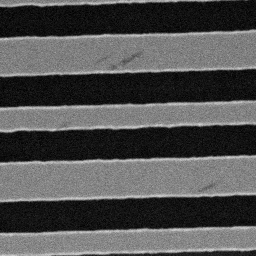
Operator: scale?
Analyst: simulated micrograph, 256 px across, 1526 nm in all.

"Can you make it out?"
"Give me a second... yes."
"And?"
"lines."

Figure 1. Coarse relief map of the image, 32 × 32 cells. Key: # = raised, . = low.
#############...................
................................
................................
................................
..........######################
################################
################################
################################
################################
................................
................................
................................
................................
################################
################################
################################
##..............................
................................
................................
..............................##
################################
################################
################################
################################
#########################.......
................................
................................
................................
........................########
################################
################################
#######################.........